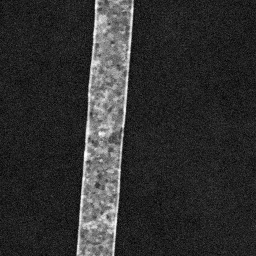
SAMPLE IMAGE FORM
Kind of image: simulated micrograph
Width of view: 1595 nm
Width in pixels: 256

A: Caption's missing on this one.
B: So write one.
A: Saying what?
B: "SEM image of one or a few lines or trenches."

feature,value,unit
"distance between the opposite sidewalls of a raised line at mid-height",0.223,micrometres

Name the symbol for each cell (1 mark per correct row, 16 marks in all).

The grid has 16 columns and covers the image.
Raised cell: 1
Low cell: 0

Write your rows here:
0000001100000000
0000001100000000
0000001100000000
0000001100000000
0000001100000000
0000001100000000
0000001100000000
0000001100000000
0000011100000000
0000011100000000
0000011000000000
0000011000000000
0000011000000000
0000011000000000
0000011000000000
0000011000000000